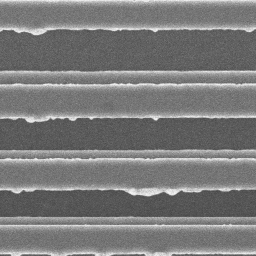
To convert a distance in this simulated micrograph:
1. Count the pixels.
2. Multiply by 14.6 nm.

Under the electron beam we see lines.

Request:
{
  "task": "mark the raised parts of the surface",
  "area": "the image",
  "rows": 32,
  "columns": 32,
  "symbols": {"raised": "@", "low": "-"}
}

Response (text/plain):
@@@@@@@@@@@@@@@@@@@@@@@@@@@@@@@@
@@@@@@@@@@@@@@@@@@@@@@@@@@@@@@@@
@@@@@@@@@@@@@@@@@@@@@@@@@@@@@@@@
@@@@@@@@@@@@@@@@@@@@@@@@@@@@@@@@
--------------------------------
--------------------------------
--------------------------------
--------------------------------
--------------------------------
@@@@@@@@@@@@@@@@@@@@@@@@@@@@@@@@
@@@@@@@@@@@@@@@@@@@@@@@@@@@@@@@@
@@@@@@@@@@@@@@@@@@@@@@@@@@@@@@@@
@@@@@@@@@@@@@@@@@@@@@@@@@@@@@@@@
@@@@@@@@@@@@@@@@@@@@@@@@@@@@@@@@
@@@@@@@@@@@@@@@@@@@@@@@@@@@@@@@@
--------------------------------
--------------------------------
--------------------------------
--------------------------------
@@@@@@@@@@@@@@@@@@@@@@@@@@@@@@@@
@@@@@@@@@@@@@@@@@@@@@@@@@@@@@@@@
@@@@@@@@@@@@@@@@@@@@@@@@@@@@@@@@
@@@@@@@@@@@@@@@@@@@@@@@@@@@@@@@@
@@@@@@@@@@@@@@@@@@@@@@@@@@@@@@@@
--------------------------------
--------------------------------
--------------------------------
@@@@@@@@@@@@@@@@@@@@@@@@@@@@@@@@
@@@@@@@@@@@@@@@@@@@@@@@@@@@@@@@@
@@@@@@@@@@@@@@@@@@@@@@@@@@@@@@@@
@@@@@@@@@@@@@@@@@@@@@@@@@@@@@@@@
@@@@@@@@@@@@@@@@@@@@@@@@@@@@@@@@